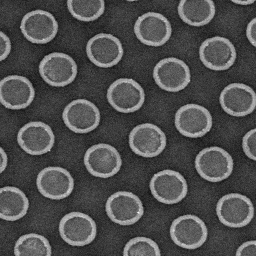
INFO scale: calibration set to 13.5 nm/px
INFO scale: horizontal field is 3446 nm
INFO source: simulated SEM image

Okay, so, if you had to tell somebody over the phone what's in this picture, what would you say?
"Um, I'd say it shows a regular array of raised bodies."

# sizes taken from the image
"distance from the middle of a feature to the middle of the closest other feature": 0.659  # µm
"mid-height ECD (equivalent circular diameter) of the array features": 430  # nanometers